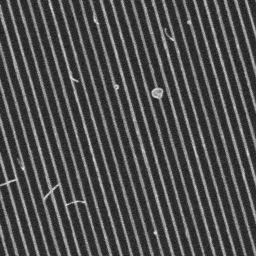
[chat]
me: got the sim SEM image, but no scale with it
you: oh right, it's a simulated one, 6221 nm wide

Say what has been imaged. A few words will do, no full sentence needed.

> parallel lines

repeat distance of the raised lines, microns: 0.242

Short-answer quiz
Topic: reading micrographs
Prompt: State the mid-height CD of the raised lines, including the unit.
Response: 46.8 nanometers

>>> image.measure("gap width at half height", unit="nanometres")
193